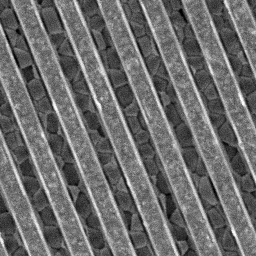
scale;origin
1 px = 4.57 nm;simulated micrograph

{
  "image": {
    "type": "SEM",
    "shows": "parallel lines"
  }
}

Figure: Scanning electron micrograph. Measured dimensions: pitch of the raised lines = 181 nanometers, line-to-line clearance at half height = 0.0885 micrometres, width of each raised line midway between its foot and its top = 92.8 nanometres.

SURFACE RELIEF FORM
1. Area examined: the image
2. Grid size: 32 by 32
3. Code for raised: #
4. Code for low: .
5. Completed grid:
..##...###..###...##...###..###.
..###..###...##...###..###...##.
..###.#.###..###..###...###..###
...###..###...##...###..###..###
#..###...##...###..###..###...##
#...##...###..###...##...###..##
#...###..###...##...###..###...#
###.###...###..###..###...###..#
##...###..###...##...###..###..#
###..###...##...###..###...##...
###...##...###..###...##...###..
.##...###..###...##...###..###..
.###..###...###..###..###...##..
..##...###..###...##...###..###.
..###..###...##...###..###...##.
..###...##...###..###...##...###
...##...###..###...##...###..###
#..###...##...###..###..###...##
#...##...###..###...##...###..##
#...###..###...##...###..###...#
##..###...##...###..###...##...#
##...##...###..###...###..###..#
###..###...##...###..###...##...
###...##...###..###...##...###..
.##...###..###...##...###..###..
.###..###...##...###..###...##..
.###...###..###..###...###..###.
..###..###..###...###..###...##.
..###...##...###..###...##...###
...##...###..###...##...###..###
...###..###...##...###..###...##
#..###...###..###..###...###..##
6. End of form